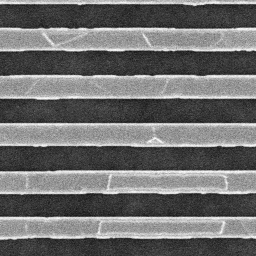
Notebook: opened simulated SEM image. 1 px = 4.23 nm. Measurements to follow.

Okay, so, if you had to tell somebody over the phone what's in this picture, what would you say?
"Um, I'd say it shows lines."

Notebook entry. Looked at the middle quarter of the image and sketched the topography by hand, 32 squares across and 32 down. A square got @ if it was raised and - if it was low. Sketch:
--------------------------------
--------------------------------
--------------------------------
@@@@@@@@@@@@@@@@@@@@@@@@@@@@@@@@
@@@@@@@@@@@@@@@@@@@@@@@@@@@@@@@@
@@@@@@@@@@@@@@@@@@@@@@@@@@@@@@@@
@@@@@@@@@@@@@@@@@@@@@@@@@@@@@@@@
@@@@@@@@@@@@@@@@@@@@@@@@@@@@@@@@
--------------------------------
--------------------------------
--------------------------------
--------------------------------
--------------------------------
--------------------------------
--------------------------------
@@@@@@@@@@@@@@@@@@@@@@@@@@@@@@@@
@@@@@@@@@@@@@@@@@@@@@@@@@@@@@@@@
@@@@@@@@@@@@@@@@@@@@@@@@@@@@@@@@
@@@@@@@@@@@@@@@@@@@@@@@@@@@@@@@@
@@@@@@@@@@@@@@@@@@@@@@@@@@@@@@@@
------------------@@@@@@@@@@@@-@
--------------------------------
--------------------------------
--------------------------------
--------------------------------
--------------------------------
--------------------------------
@@@@@@@@@@@@@@@@@@@@@@@@@@@@@@@@
@@@@@@@@@@@@@@@@@@@@@@@@@@@@@@@@
@@@@@@@@@@@@@@@@@@@@@@@@@@@@@@@@
@@@@@@@@@@@@@@@@@@@@@@@@@@@@@@@@
@@@@@@@@@@@@@@@@@@@@@@@@@@@@@@@@